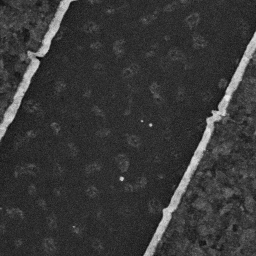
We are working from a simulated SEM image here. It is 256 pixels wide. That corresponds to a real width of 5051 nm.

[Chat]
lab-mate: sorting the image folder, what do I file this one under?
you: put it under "one or a few lines or trenches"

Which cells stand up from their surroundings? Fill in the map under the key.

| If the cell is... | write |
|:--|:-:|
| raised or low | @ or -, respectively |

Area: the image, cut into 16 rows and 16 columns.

@@@@------------
@@@@------------
@@@-------------
@@-------------@
@@-------------@
@-------------@@
@-------------@@
@------------@@@
-------------@@@
------------@@@@
------------@@@@
-----------@@@@@
-----------@@@@@
----------@@@@@@
----------@@@@@@
---------@@@@@@@